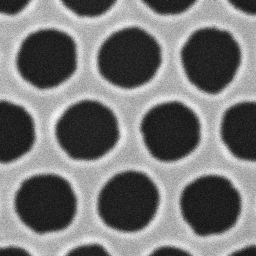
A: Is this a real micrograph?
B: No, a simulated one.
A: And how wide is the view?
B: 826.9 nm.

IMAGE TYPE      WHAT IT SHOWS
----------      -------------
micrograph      a regular array of holes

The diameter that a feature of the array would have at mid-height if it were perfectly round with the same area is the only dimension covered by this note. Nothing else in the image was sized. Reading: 205 nanometers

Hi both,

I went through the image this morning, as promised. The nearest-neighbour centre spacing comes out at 265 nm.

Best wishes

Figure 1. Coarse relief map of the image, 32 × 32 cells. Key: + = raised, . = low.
....++++......++++......+++++...
...++++++....++++++....+++++++..
++++++++++++++++++++++++++++++++
++++++++++++++++..+++++++..+++++
+++......+++++.....+++++.....+++
++........+++.......+++.......++
++........++........+++.......++
++........++........+++.......++
++........++........+++.......++
+++......++++......++++......+++
++++....++++++....++++++.....+++
+++++++++++++++++++++++++...++++
.+++++++++..++++++++++++++++++++
...+++++......+++++.....++++....
....++++......++++.......+++....
....+++........+++.......+++....
....+++........+++.......++.....
....+++........+++.......+++....
....++++......++++.......+++....
...+++++.....++++++....++++++...
.+++++++++++++++++++++++++++++++
+++++++++++++++...++++++++++++++
+++.....++++++.....+++++.....+++
++.......++++.......+++.......++
++........++........+++.......++
++........++........++........++
++........++........+++.......++
++.......++++......++++.......++
++++....++++++....++++++.....+++
+++++++++++++++++++++++++.++++++
++++++++++...+++++++++++++++++++
....++++......+++++.....+++++...